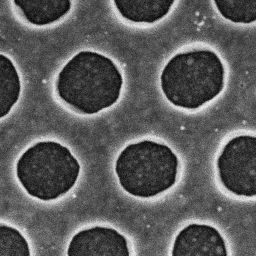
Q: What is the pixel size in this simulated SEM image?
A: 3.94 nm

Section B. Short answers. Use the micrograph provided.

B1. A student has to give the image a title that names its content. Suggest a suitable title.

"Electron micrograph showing holes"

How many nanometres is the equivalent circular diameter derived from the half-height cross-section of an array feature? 243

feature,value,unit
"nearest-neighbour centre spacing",98.5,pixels